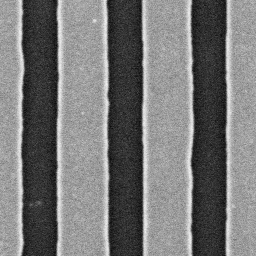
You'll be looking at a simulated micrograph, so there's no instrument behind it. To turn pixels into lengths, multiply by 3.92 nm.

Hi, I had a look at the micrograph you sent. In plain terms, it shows lines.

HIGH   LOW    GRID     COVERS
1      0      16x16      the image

1000111001110011
1000111001110011
1000111001110011
1000111001110011
1000111001110011
1000111001110011
1000111001110011
1000111001110011
1000111001110011
1000111001110011
1000111001110011
1000111001110011
1000111001110011
1000111001110011
1000111001110011
1000111001110011